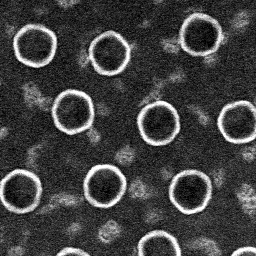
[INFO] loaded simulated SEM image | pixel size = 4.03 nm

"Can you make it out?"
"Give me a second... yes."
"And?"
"a regular array of raised bodies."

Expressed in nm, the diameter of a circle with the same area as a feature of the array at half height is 161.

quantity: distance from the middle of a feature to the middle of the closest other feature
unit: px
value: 75.2